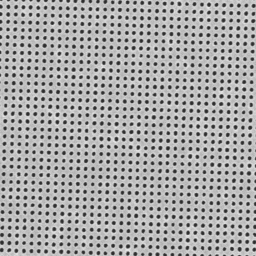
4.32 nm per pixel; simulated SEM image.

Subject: a regular array of holes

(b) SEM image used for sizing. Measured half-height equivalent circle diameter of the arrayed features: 16.9 nanometres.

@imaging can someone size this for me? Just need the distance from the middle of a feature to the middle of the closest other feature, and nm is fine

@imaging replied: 30.3